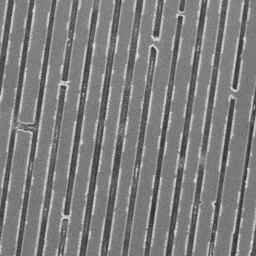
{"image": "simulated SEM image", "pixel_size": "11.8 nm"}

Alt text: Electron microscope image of parallel lines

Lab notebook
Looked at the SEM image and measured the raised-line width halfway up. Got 177 nm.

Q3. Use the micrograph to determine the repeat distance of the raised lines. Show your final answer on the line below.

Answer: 252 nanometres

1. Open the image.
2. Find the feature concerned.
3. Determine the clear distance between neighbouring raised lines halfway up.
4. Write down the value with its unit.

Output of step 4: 73.3 nm